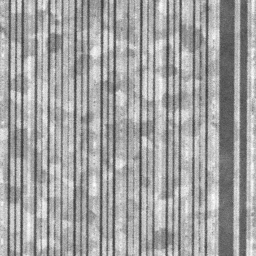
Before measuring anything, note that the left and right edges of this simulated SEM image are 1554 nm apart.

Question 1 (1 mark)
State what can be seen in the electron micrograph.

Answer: parallel lines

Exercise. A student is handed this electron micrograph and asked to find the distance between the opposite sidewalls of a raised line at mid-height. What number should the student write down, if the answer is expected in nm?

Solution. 29.6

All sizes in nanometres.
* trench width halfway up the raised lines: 17.5